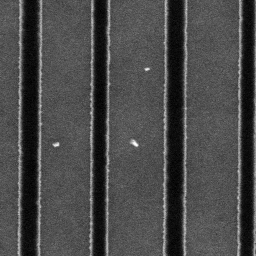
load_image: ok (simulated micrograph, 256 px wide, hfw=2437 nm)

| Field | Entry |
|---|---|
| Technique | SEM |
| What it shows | lines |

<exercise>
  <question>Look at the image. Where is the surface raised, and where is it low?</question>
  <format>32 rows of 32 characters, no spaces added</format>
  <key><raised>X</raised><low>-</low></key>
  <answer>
---XX------XXX-------XX-------XX
---XX------XXX-------XX-------XX
---XX------XXX-------XX-------XX
---XX------XXX-------XX-------XX
---XX------XXX-------XX-------XX
---XX------XXX-------XX-------XX
---XX------XXX-------XX-------XX
---XX------XXX-------XX-------XX
--XXX------XXX-------XX-------XX
--XXX------XXX-------XX-------XX
--XXX------XXX-------XX-------XX
--XXX------XXX-------XX-------XX
--XXX------XXX-------XX-------XX
--XXX------XXX-------XX-------XX
--XXX------XXX-------XX-------XX
--XXX------XXX-------XX-------XX
--XXX------XXX-------XX-------XX
--XXX------XXX-------XX-------XX
--XXX------XXX-------XX-------XX
--XXX------XXX-------XX-------XX
--XXX------XXX-------XX-------XX
--XXX------XXX-------XX-------XX
--XXX------XX--------XX-------XX
--XXX------XX--------XX-------XX
--XXX------XX--------XX-------XX
--XXX------XX-------XXX-------XX
--XXX------XX--------XX-------XX
--XXX------XX-------XXX-------XX
--XXX------XX-------XXX-------XX
--XXX------XX-------XXX-------XX
--XXX------XX-------XXX-------XX
--XXX------XX-------XXX-------XX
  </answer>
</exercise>